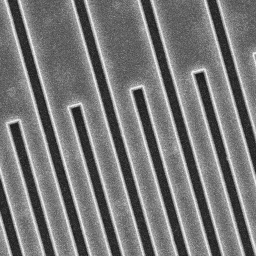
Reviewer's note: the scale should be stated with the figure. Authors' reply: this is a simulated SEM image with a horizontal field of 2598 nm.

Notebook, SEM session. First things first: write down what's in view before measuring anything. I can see parallel lines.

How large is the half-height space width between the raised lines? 120 nm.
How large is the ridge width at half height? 209 nm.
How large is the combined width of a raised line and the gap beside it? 325 nm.